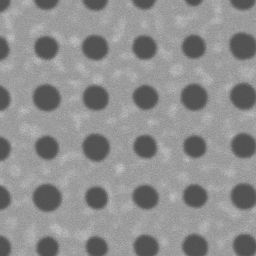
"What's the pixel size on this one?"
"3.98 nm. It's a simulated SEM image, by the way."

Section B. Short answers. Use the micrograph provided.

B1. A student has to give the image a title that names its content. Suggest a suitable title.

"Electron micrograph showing a regular array of holes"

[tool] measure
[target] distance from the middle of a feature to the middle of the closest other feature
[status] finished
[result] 196 nm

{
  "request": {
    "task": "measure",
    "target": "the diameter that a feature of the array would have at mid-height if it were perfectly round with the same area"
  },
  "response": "97.5 nanometers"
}